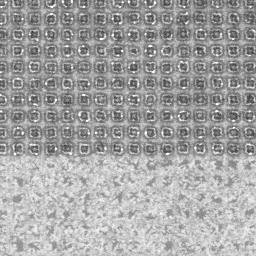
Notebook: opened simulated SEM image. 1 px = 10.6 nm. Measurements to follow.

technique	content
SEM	a regular array of raised bodies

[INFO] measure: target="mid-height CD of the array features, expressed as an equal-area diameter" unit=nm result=104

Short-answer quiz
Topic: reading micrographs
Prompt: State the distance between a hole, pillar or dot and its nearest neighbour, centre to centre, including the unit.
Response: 170 nm